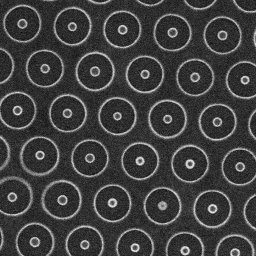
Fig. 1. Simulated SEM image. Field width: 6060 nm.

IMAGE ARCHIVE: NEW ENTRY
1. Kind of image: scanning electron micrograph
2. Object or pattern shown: an array of small figures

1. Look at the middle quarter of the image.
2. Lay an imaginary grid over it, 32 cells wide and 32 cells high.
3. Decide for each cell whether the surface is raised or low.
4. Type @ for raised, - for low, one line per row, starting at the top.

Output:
@@@---------@@@@--------@@@@@@--
@@@----@@---@@@@---------@@@@---
@@@----@@---@@@@---@@----@@@----
@@@---------@@@@---------@@@----
@@@@--------@@@@--------@@@@@---
@@@@@------@@@@@@-------@@@@@---
@@@@@@@-@@@@@@@@@@----@@@@@@@@--
@@@@@@@@@@@@@@@@@@@@@@@@@@@@@@@-
---@@@@@@@@@@@@@@@@@@@@@@@@@@@@@
----@@@@@@@-----@@@@@@@@---@@@@@
-----@@@@@-------@@@@@@------@@@
@----@@@@---------@@@@--------@@
@@---@@@@----@----@@@@--------@@
-----@@@@----@----@@@----@@---@@
-----@@@@---------@@@----@@---@@
----@@@@@@-------@@@@@--------@@
--@@@@@@@@@-----@@@@@@--------@@
@@@@@@@@@@@@@-@@@@@@@@@-----@@@@
@@@@@@@@@@@@@@@@@@@@@@@@@@@@@@@@
@@@@@---@@@@@@@@@@@@@@@@@@@@@@@@
@@@-------@@@@@@@-----@@@@@@@@@-
@@@-------@@@@@@------@@@@@@@---
@@----@----@@@@--------@@@@@----
@@----@@---@@@@---@-----@@@-----
@@---------@@@@---@@----@@@----@
@@@-------@@@@@--------@@@@----@
@@@-------@@@@@--------@@@@-----
@@@@----@@@@@@@@------@@@@@@----
@@@@@@@@@@@@@@@@@@--@@@@@@@@@---
-@@@@@@@@@@@@@@@@@@@@@@@@@@@@@@-
--@@@@@@@@@--@@@@@@@@@@@@@@@@@@@
---@@@@@@------@@@@@@@@----@@@@@